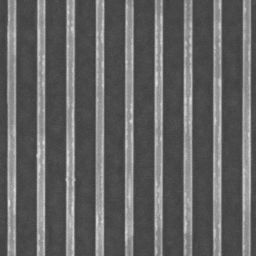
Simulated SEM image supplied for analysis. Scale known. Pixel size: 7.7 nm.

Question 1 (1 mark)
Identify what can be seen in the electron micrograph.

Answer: parallel lines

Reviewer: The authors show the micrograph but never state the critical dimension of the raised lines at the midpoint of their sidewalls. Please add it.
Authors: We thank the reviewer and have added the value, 56.3 nm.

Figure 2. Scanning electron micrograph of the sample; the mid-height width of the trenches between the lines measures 168 nm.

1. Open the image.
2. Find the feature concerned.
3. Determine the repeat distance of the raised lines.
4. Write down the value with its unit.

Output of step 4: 226 nm